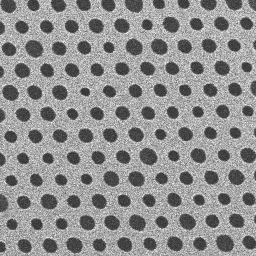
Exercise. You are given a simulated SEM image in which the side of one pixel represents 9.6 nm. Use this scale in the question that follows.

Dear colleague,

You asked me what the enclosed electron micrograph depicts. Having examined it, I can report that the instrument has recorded a regular array of holes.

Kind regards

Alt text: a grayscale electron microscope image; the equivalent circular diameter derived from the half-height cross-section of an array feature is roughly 128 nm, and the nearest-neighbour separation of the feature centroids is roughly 24.6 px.